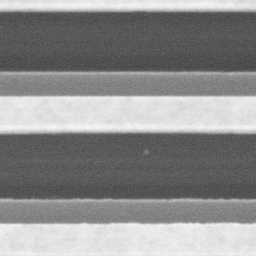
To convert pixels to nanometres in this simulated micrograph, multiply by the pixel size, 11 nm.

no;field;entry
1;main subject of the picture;lines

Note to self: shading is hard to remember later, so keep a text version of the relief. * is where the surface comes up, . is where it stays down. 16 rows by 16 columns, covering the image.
****************
................
................
................
................
****************
****************
****************
................
................
................
................
................
****************
****************
****************